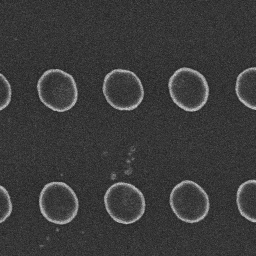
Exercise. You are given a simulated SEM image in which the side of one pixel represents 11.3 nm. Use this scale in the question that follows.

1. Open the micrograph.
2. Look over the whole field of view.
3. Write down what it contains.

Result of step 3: raised bodies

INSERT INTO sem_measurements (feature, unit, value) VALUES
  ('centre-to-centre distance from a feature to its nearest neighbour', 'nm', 740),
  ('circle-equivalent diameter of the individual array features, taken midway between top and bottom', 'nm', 441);